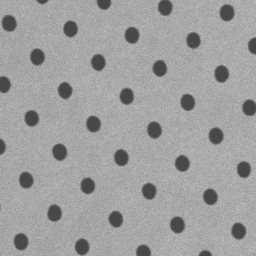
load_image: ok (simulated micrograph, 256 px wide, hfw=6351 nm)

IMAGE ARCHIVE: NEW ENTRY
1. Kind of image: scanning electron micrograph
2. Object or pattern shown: a regular array of holes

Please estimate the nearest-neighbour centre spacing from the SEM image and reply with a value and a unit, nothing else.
1.08 micrometres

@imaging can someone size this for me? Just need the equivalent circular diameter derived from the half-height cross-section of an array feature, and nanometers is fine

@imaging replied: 395